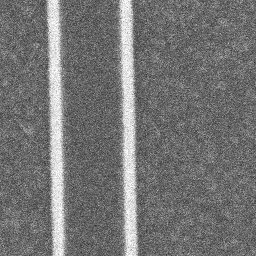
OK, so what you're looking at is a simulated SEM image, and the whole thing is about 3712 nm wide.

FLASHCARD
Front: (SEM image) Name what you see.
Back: one or a few lines or trenches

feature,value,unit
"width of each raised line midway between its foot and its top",1050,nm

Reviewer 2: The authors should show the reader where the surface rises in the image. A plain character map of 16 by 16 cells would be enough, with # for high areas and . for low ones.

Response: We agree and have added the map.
...#####........
...#####........
...#####........
...#####........
...#####........
....####........
....####........
....####........
....####........
....####........
....####........
....####........
....####........
....####........
....####........
....####........